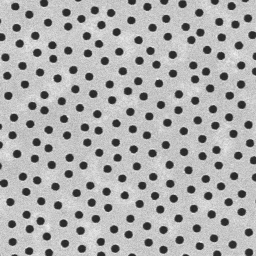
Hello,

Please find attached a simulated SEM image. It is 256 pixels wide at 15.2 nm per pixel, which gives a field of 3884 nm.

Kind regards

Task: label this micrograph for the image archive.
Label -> a regular array of holes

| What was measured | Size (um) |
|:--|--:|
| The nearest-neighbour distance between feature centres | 0.247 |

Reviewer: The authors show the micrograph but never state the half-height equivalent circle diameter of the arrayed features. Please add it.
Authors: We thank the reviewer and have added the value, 129 nanometres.